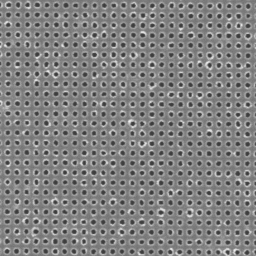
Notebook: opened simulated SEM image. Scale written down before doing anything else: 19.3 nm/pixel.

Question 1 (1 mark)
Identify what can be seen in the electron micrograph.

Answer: a regular array of holes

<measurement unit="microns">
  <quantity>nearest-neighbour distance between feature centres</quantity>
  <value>0.179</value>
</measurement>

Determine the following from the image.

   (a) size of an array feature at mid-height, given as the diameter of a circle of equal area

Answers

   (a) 0.0924 µm